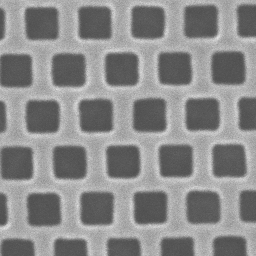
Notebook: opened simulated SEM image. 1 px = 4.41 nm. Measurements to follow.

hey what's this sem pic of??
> a regular array of holes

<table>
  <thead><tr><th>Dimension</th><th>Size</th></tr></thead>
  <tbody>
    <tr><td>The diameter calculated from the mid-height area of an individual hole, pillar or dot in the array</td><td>167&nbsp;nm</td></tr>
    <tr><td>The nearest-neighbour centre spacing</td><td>234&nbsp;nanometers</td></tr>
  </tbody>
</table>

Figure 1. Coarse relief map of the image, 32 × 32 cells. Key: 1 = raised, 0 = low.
11111111111111111111111111111100
01100001110000110000011000011100
01100001110000110000011000011100
01100001110000110000011000011100
01100001110000111000111000011100
11111111111111111111111111111111
11111111111111001111000111100011
00001100000110000111000011000001
00001100000110000111000011000001
00001100000110000111000011000001
00001110000110000111000011100011
11111111111111111111111111111111
11110001110000111000111000011100
01100001110000111000011000001100
01100001110000111000011000001100
01100001110000110000011000001100
01110001110000111000111111111111
11111111111111111111111111111111
00001110000110000111000011100001
00001110000110000011000011100001
00001110000110000011000011100001
00001110000110000111000011100001
10001111111111111111111111111111
11111111111111111111111111111111
01100001110000111000011000011100
01100000110000111000011000001100
01100000110000111000011000001100
01100000110000111000011000001100
11111111111111111111111111111111
11111111111111111111111111100011
00001110000110000011000011100001
00001110000110000011000011100001